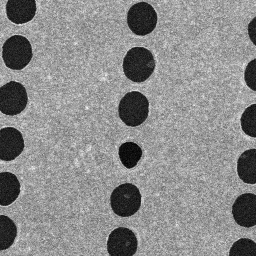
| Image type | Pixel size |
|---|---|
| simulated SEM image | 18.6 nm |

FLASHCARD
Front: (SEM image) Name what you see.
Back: holes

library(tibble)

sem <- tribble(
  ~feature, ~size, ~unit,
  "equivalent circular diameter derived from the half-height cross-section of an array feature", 614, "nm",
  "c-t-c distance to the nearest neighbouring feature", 0.85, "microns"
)